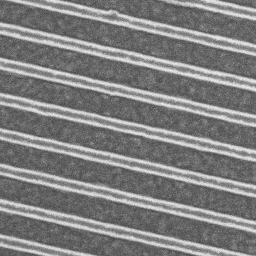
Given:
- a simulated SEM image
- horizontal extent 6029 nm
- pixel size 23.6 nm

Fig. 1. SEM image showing parallel lines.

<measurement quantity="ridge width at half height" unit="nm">210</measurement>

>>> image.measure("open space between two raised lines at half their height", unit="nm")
609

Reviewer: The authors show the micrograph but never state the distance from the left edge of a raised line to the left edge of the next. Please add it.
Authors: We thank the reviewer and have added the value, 812 nm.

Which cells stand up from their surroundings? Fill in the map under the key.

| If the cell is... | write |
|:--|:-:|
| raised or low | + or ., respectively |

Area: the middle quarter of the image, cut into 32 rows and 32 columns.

.....................+++++++++..
.........................+++++++
+.............................++
+++++...........................
++++++++++......................
....++++++++++..................
.........++++++++...............
.............++++++++++.........
.................++++++++++.....
......................++++++++++
..........................++++++
++.............................+
++++++..........................
.+++++++++......................
.....++++++++++.................
..........++++++++++............
..............++++++++++........
...................++++++++++...
.......................+++++++++
............................++++
++..............................
+++++++.........................
.++++++++++.....................
......+++++++++.................
..........++++++++++............
...............+++++++++........
...................++++++++++...
.......................+++++++++
............................++++
+++.............................
+++++++.........................
.+++++++++++....................